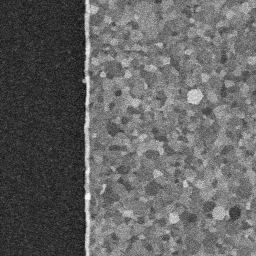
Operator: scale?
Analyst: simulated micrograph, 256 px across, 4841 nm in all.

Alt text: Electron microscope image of one or a few lines or trenches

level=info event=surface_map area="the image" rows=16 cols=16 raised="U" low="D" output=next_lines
DDDDDUUUUUUUUUUU
DDDDDUUUUUUUUUUU
DDDDDUUUUUUUUUUU
DDDDDUUUUUUUUUUU
DDDDDUUUUUUUUUUU
DDDDDUUUUUUUUUUU
DDDDDUUUUUUUUUUU
DDDDDUUUUUUUUUUU
DDDDDUUUUUUUUUUU
DDDDDUUUUUUUUUUU
DDDDDUUUUUUUUUUU
DDDDDUUUUUUUUUUU
DDDDDUUUUUUUUUUU
DDDDDUUUUUUUUUUU
DDDDDUUUUUUUUUUU
DDDDDUUUUUUUUUUU